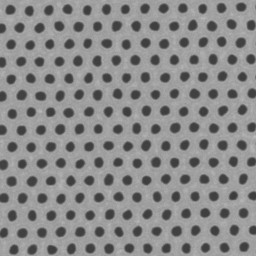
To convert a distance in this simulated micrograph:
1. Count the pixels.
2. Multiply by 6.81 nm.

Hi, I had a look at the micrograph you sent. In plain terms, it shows a regular array of holes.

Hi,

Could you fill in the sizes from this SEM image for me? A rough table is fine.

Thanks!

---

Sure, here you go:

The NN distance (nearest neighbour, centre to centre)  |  0.128 um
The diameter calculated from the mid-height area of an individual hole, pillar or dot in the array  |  0.0661 um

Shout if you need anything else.